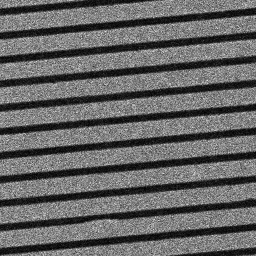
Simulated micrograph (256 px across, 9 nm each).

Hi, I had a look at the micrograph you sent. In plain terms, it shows parallel lines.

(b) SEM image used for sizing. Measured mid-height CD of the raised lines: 0.16 microns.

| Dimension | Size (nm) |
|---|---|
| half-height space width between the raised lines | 55.9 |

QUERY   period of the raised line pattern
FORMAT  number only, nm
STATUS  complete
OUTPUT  214